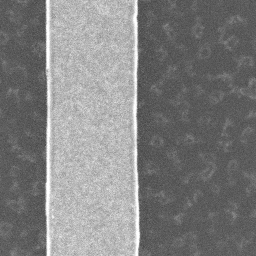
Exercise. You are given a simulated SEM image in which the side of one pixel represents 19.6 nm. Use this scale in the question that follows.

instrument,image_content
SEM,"one or a few lines or trenches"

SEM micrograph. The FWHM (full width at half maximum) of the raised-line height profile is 1730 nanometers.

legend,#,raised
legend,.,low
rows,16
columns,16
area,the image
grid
...######.......
...#####........
...######.......
...######.......
...######.......
...######.......
...#####........
...#####........
...#####........
...#####........
...#####........
...######.......
...######.......
...######.......
...######.......
...######.......